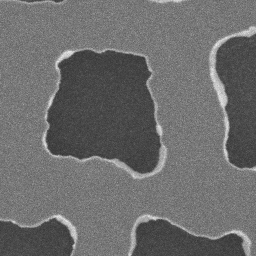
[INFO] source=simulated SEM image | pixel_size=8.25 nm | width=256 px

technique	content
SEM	holes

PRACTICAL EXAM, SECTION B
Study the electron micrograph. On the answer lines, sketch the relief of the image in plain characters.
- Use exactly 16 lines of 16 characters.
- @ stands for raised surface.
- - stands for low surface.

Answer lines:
@@@@@@@@@@@@@@@@
@@@@@@@@@@@@@@@@
@@@@@@@@@@@@@@--
@@@@-----@@@@---
@@@@-----@@@@---
@@@@-----@@@@@--
@@@-------@@@@--
@@@-------@@@@--
@@@-------@@@@--
@@@-------@@@@--
@@@@@@@@--@@@@@-
@@@@@@@@@@@@@@@@
@@@@@@@@@@@@@@@@
@@@@@@@@@@@@@@@@
-----@@@----@@@@
-----@@@--------